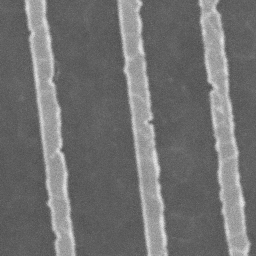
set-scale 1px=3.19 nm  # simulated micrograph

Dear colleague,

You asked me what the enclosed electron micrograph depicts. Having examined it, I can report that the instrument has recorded one or a few lines or trenches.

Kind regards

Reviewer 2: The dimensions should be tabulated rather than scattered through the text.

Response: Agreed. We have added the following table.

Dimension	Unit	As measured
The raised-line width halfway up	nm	56.9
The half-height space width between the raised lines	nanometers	220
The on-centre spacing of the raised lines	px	85.9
